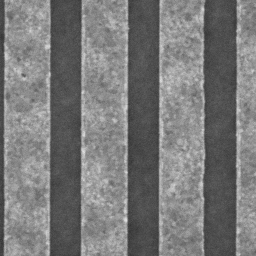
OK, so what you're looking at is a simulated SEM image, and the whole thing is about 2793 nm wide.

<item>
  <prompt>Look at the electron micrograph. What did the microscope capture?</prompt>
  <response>one or a few lines or trenches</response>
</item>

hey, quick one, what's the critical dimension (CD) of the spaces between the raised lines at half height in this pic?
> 362 nm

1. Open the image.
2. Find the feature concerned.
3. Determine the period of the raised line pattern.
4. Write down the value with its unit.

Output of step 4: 77 px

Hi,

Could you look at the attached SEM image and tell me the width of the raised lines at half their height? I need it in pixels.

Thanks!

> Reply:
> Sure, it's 44.3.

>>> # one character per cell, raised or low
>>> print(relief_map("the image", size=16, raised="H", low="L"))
HHHLLHHHLLHHHLLH
HHHLLHHHLLHHHLLH
HHHLLHHHLLHHHLLH
HHHLLHHHLLHHHLLH
HLHLLHHHLLHHHLLH
HHHLLHHHLLHHHLLH
HHHLLHHHLLHHHLLH
HHHLLHHHLLHHHLLH
HHHLLHHHLLHHHLLH
HHHLLHHHLLHHHLLH
HHHLLHHHLLHHHLLH
HHHLLHHHLLHHHLLH
HHHLLHHHLLHHHLLH
HHHLLHHHLLHHHLLH
HHHLLHHHLLHHHLLH
HHHLLHHHLLHHHLLH